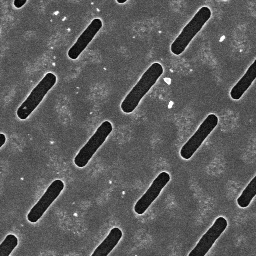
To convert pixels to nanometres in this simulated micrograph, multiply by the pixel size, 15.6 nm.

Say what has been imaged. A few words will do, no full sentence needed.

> a regular array of holes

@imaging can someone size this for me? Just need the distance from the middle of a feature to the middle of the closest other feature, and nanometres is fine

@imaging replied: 1150